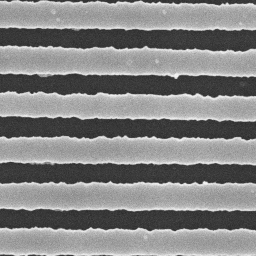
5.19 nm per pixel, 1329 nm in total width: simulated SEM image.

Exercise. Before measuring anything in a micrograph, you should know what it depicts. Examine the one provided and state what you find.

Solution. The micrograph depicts lines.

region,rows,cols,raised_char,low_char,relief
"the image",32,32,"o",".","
oooooooooooooooooooooooooo...o.o
oooooooooooooooooooooooooooooooo
oooooooooooooooooooooooooooooooo
o.oooooooooooooooooooooooooooooo
................................
................................
oooooooooooooooooooooooooooooooo
oooooooooooooooooooooooooooooooo
oooooooooooooooooooooooooooooooo
.....................o......oooo
................................
.o..............................
oooooooooooooooooooooooooooooooo
oooooooooooooooooooooooooooooooo
o.oooooooooooooooooooooooooooooo
................................
................................
oooooooooooooooooooooooooooooooo
oooooooooooooooooooooooooooooooo
oooooooooooooooooooooooooooooooo
.......................o......oo
................................
................................
oooooooooooooooooooooooooooooooo
oooooooooooooooooooooooooooooooo
oooooooooooooooooooooooooooooooo
................................
................................
....oo..........................
oooooooooooooooooooooooooooooooo
oooooooooooooooooooooooooooooooo
oooooooooooooooooooooooooooooooo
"